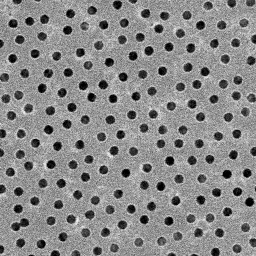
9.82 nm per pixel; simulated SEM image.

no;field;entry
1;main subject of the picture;a regular array of holes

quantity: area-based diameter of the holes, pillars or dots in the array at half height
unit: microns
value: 0.1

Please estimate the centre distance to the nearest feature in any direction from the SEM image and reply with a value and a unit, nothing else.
172 nanometres